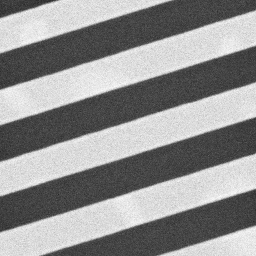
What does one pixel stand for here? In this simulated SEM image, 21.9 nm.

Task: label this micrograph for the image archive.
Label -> lines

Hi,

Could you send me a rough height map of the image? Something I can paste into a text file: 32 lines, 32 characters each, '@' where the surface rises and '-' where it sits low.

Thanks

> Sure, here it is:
------@@@@@@@@@@@@@@------------
---@@@@@@@@@@@@@---------------@
@@@@@@@@@@@@@---------------@@@@
@@@@@@@@@@---------------@@@@@@@
@@@@@@@---------------@@@@@@@@@@
@@@@--------------@@@@@@@@@@@@@@
---------------@@@@@@@@@@@@@@---
------------@@@@@@@@@@@@@@------
---------@@@@@@@@@@@@@@---------
------@@@@@@@@@@@@@@------------
--@@@@@@@@@@@@@@---------------@
@@@@@@@@@@@@@---------------@@@@
@@@@@@@@@@---------------@@@@@@@
@@@@@@@---------------@@@@@@@@@@
@@@@---------------@@@@@@@@@@@@@
---------------@@@@@@@@@@@@@@---
------------@@@@@@@@@@@@@@------
---------@@@@@@@@@@@@@@---------
------@@@@@@@@@@@@@-------------
---@@@@@@@@@@@@@---------------@
@@@@@@@@@@@@@---------------@@@@
@@@@@@@@@@---------------@@@@@@@
@@@@@@---------------@@@@@@@@@@@
@@@---------------@@@@@@@@@@@@@@
---------------@@@@@@@@@@@@@@---
------------@@@@@@@@@@@@@@------
--------@@@@@@@@@@@@@@----------
-----@@@@@@@@@@@@@@-------------
--@@@@@@@@@@@@@@---------------@
@@@@@@@@@@@@@---------------@@@@
@@@@@@@@@@---------------@@@@@@@
@@@@@@---------------@@@@@@@@@@@